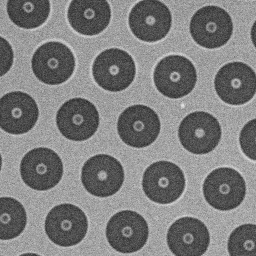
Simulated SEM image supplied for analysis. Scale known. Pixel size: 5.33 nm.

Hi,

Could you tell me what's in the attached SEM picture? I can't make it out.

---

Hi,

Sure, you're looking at an array of small figures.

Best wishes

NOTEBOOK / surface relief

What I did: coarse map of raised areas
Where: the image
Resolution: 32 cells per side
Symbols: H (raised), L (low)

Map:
HLLHLLHHHLLLLLHHHLLLLHHHHHHHHHHH
HLLLLLHHLLLHLLHHLLLLLHHHLLLLHHHH
HLLLLLHHLLLLLLHHLLHLLLHHLLLLLHHH
HHHLLHHHHLLLLHHHLLLLLHHHLLHLLHHL
HHHHHHHHHHHLHHHHHLLLLHHHLLLLLHHL
LHHHHLLLHHHHHHHHHHHHHHHHHLLLHHHH
LLHHLLLLLHHHHLLLHHHHHHHHHHHHHHHH
LLHHLLHLLHHHLLLLLHHHLLLLHHHHHHHH
LHHHLLLLLHHLLLLLLHHLLLLLHHHHLLLH
HHHHLLLLLHHHLLLLLHHLLHLLLHHLLLLL
HHHHHHLLHHHHLLLLHHHLLLLLHHHLLHLL
HLLHHHHHHHHHHHHHHHHHLLLLHHHLLLLL
LLLLHHHHHLLHHHHHHHHHHHHHHHHHLLLH
LLLLLHHLLLLLHHHHLLLHHHHHHHHHHHHH
LLLLLHHLLHLLHHHLLLLLHHHLLLLHHHHH
LLLLHHHLLLLLHHHLLHLLHHLLLLLHHHHL
HLLHHHHLLLLLHHHLLLLLHHLLLLLLHHLL
HHHHHHHHHLLHHHHLLLLHHHLLLLLLHHLL
HHHHLLHHHHHHHHHHHLHHHHHLLLLHHHLL
HHHLLLLHHHHHLLHHHHHHHHHHHHHHHHHL
HHHLLLLLHHLLLLLHHHHLLLHHHHHHHHHH
HHLLLLLLHHLLLLLLHHLLLLLHHHLLLLHH
HHHLLLLLHHLLLLLHHHLLHLLHHLLLLLLH
HHHHLLLHHHHLLLLHHHLLLLLHHLLLHLLH
HHHHHHHHHHHHLLHHHHLLLLLHHLLLLLLH
LLLHHHHHLHHHHHHHHHHHLHHHHHLLLLHH
LLLHHHLLLLHHHHHLLHHHHHHHHHHHHHHH
HLLHHHLLLLLHHHLLLLHHHHLLLHHHHHHH
LLLHHHLLHLLHHLLLLLLHHLLLLLHHHLLL
LLHHHHLLLLLHHLLLLLLHHLLHLLHHHLLL
HHHHHHHLLLHHHHLLLLHHHLLLLLHHLLLH
HHHHHHHHHHHHHHHLLHHHHLLLLLHHHLLL